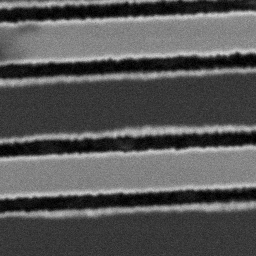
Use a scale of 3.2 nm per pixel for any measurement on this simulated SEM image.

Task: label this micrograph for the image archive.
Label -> lines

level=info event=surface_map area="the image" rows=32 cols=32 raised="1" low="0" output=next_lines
11111111111000000000000000000000
00000000000000000000000000000111
00000000010111111111111111111111
11111111111111111111111111111111
11111111111111111111111111111111
11111111111111111111111111111111
11111111111111111111111111111111
11111111111110100000000000000000
00000000000000000000000000000000
00000000000001111111111111111111
11111111111111111111111111111111
11111111111111111111111111111111
11111111111111111111111111111111
11111111111111111111111111111111
11111111111111111111111111111111
11111111111111111111111111111111
11111111111111111111111110000000
11110000000000000000000000000000
00000000000000000000000011111111
00000111111111111111111111111111
11111111111111111111111111111111
11111111111111111111111111111111
11111111111111111111111111111111
11111111111111111111111111111000
11111110000000000000000000000000
00000000000000000000000000000111
00000100111111111111111111111111
11111111111111111111111111111111
11111111111111111111111111111111
11111111111111111111111111111111
11111111111111111111111111111111
11111111111111111111111111111111